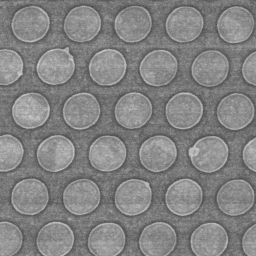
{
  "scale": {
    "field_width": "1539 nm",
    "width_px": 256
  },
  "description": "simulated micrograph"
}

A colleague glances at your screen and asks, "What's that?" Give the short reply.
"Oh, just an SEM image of a regular array of raised bodies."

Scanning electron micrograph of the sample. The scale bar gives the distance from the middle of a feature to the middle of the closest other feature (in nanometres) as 300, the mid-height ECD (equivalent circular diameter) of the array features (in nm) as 218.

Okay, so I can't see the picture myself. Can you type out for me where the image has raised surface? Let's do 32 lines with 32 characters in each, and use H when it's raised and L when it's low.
LLLLLLLLLLLLLLLLLLLLLLLLLLLLLLLL
LLHHHHLLLHHHLLLHHHLLLLHHHLLLHHHL
LLHHHHLLHHHHHLHHHHHLLHHHHLLHHHHH
LLHHHHLLHHHHLLHHHHHLLHHHHLLHHHHH
LLHHHLLLLHHHLLLHHHLLLHHHHLLLHHHL
LLLLLLLLLLLLLLLLLLLLLLLLLLLLLLLL
HHLLLLHHHLLLLHHLLLLHHLLLLLHLLLLL
HHHLLHHHHLLHHHHHLLHHHHLLHHHHLLLH
HHHLLHHHHLLHHHHHLLHHHHLLHHHHHLHH
HHLLLHHHHLLHHHHLLLHHHHLLHHHHLLHH
HLLLLLLLLLLLHHLLLLLHHLLLLHHLLLLL
LLLLLLLLLLLLLLLLLLLLLLLLLLLLLLLL
LLHHHHLLLHHHLLLHHHHLLHHHHLLLHHHL
LLHHHHLLHHHHLLHHHHHLLHHHHLLHHHHH
LLHHHHLLHHHHLLHHHHHLLHHHHLLHHHHH
LLHHHLLLLHHHLLLHHHLLLHHHLLLLHHHL
LLLLLLLLLLLLLLLLLLLLLLLLLLLLLLLL
HHLLLLHHHLLLHHHLLLHHHLLLLHHHLLLL
HHHLLHHHHLLHHHHHLLHHHHLLHHHHLLLH
HHHLLHHHHLLHHHHHLLHHHHLLHHHHLLHH
HHLLLHHHHLLLHHHLLLHHHLLLHHHHLLLH
LLLLLLLLLLLLLLLLLLLLLLLLLLLLLLLL
LLLHLLLLLLHLLLLLHLLLLLLHLLLLLLLL
LLHHHHLLHHHHLLLHHHHLLHHHHLLLHHHL
LLHHHHLLHHHHLLHHHHHLLHHHHLLHHHHH
LLHHHHLLHHHHLLLHHHHLLHHHHLLHHHHH
LLLHHLLLLHHLLLLHHHLLLLHHLLLLHHHL
LLLLLLLLLLLLLLLLLLLLLLLLLLLLLLLL
HHLLLHHHHLLLHHHLLLHHHLLLLHHHLLLH
HHHLLHHHHLLHHHHHLLHHHHLLHHHHLLLH
HHHLLHHHHLLHHHHHLHHHHHLLHHHHLLHH
HHLLLHHHLLLHHHHLLLHHHLLLHHHHLLLH